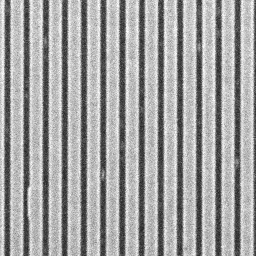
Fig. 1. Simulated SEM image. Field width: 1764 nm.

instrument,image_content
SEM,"parallel lines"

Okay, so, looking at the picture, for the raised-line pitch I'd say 132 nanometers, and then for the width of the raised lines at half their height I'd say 0.0806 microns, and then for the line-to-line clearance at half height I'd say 49.1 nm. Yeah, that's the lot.